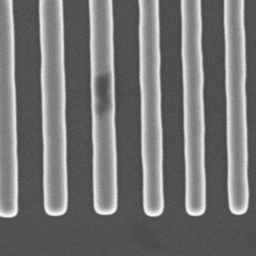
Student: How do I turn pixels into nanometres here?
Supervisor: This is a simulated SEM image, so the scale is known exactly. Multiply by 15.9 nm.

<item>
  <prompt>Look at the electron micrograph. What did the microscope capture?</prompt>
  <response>groups of lines, slits or small figures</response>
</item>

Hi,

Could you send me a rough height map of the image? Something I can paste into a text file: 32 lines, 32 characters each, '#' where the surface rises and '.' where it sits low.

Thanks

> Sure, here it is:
#....###...###...###...##...##..
#....###...###....##...##...##..
##...###...###....##...##...##..
##...###...###....##...##...##..
##...###...###....##...##...##..
##...###...###....##...##...###.
##...###...###....##...##...###.
##...###....##....##...##...###.
##...###....##....##...##...###.
##...###....##....##...##...###.
##...###....##....##...##...###.
##...###....##....##...##...###.
##...###....##....##...##...###.
##...###....##....##...##...###.
##...###....##....##...##...###.
##...###....##....##...##....##.
##...###....##....##...##....##.
##....##....##....##...##....##.
##....##....##....##...##....##.
##....##....##....##...##....##.
##....##....##....##...##....##.
##....##....##....##...###...##.
##....##....##....##...###...##.
##....##....##....##...###...##.
##....##....##....##...###...##.
##....##....##....##...###...##.
##....##....##....##....#....#..
................................
................................
................................
................................
................................